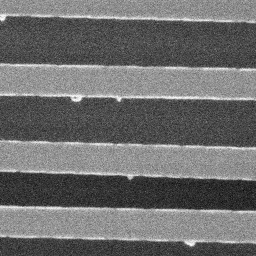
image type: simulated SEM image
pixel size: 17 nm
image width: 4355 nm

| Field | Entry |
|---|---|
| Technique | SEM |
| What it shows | lines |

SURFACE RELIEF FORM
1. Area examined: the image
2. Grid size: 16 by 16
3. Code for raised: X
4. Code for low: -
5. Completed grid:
XXXXXXXXXXXXXXXX
----------------
----------------
----------------
XXXXXXXXXXXXXXXX
XXXXXXXXXXXXXXXX
----------------
----------------
----------------
XXXXXXXXXXXXXXXX
XXXXXXXXXXXXXXXX
----------------
----------------
XXXXXXXXXXXXXXXX
XXXXXXXXXXXXXXXX
----------------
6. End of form